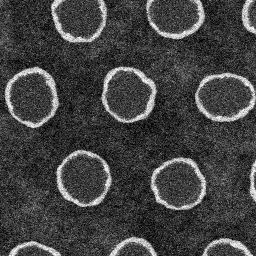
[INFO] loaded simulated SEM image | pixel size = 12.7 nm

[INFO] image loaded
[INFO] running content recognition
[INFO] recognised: raised bodies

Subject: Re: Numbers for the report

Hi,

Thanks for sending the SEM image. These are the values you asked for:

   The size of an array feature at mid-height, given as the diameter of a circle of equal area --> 662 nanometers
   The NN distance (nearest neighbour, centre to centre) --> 1210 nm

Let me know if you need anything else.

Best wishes